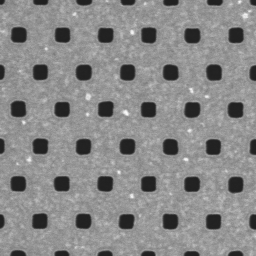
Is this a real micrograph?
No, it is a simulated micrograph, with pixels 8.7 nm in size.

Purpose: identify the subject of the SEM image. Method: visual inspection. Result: a regular array of holes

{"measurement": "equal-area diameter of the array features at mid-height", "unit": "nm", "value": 148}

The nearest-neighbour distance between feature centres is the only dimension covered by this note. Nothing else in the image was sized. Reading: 0.373 µm